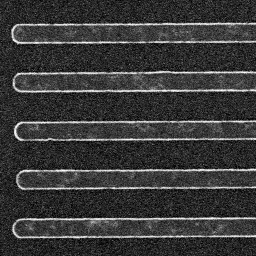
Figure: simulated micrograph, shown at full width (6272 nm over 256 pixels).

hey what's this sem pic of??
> parallel lines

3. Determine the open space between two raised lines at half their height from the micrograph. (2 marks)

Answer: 744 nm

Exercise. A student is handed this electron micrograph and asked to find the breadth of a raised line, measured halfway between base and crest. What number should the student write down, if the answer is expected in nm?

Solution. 447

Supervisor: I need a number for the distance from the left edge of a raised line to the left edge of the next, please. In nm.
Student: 1190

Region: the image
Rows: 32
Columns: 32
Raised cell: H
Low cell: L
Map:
LLLLLLLLLLLLLLLLLLLLLLLLLLLLLLLL
LLLLLLLLLLLLLLLLLLLLLLLLLLLLLLLL
LLLLLLLLLLLLLLLLLLLLLLLLLLLLLLLL
LLHHHHHHHHHHHHHHHHHHHHHHHHHHHHHH
LLHHHHHHHHHHHHHHHHHHHHHHHHHHHHHH
LLLLLLLLLLLLLLLLLLLLLLLLLLLLLLLL
LLLLLLLLLLLLLLLLLLLLLLLLLLLLLLLL
LLLLLLLLLLLLLLLLLLLLLLLLLLLLLLLL
LLLLLLLLLLLLLLLLLLLLLLLLLLLLLLLL
LLHHHHHHHHHHHHHHHHHHHHHHHHHHHHHH
LLHHHHHHHHHHHHHHHHHHHHHHHHHHHHHH
LLLLLLLLLLLLLLLLLLLLLLLLLLLLLLLL
LLLLLLLLLLLLLLLLLLLLLLLLLLLLLLLL
LLLLLLLLLLLLLLLLLLLLLLLLLLLLLLLL
LLLLLLLLLLLLLLLLLLLLLLLLLLLLLLLL
LLHHHHHHHHHHHHHHHHHHHHHHHHHHHHHH
LLHHHHHHHHHHHHHHHHHHHHHHHHHHHHHH
LLLLLLLHLLLHHLLLLLLLLLLLLLLLLLLL
LLLLLLLLLLLLLLLLLLLLLLLLLLLLLLLL
LLLLLLLLLLLLLLLLLLLLLLLLLLLLLLLL
LLLLLLLLLLLLLLLLLLLLLLLLLLLLLLLL
LLLHHHHHHHHHHHHHHHHHHHHHHHHHHHHH
LLHHHHHHHHHHHHHHHHHHHHHHHHHHHHHH
LLLHHHLLHHLLLLLLLLLLLLLLLLHLLLLL
LLLLLLLLLLLLLLLLLLLLLLLLLLLLLLLL
LLLLLLLLLLLLLLLLLLLLLLLLLLLLLLLL
LLLLLLLLLLLLLLLLLLLLLLLLLLLLLLLL
LLLHHHHHLHHHHHHHHHHHHHHHHHHHHHHH
LLHHHHHHHHHHHHHHHHHHHHHHHHHHHHHH
LLHHHHHHHHHHHHHHHHHHHLLHLLLLLLLL
LLLLLLLLLLLLLLLLLLLLLLLLLLLLLLLL
LLLLLLLLLLLLLLLLLLLLLLLLLLLLLLLL